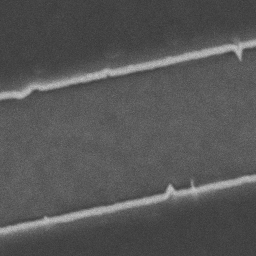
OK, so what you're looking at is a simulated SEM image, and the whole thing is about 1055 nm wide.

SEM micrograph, one or a few lines or trenches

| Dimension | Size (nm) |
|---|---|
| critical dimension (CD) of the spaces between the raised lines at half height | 540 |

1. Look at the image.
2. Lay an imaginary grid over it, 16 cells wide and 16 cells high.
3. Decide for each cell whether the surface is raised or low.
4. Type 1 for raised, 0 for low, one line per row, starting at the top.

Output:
1111111111111111
1111111111111111
1111111111111111
1111111111110000
1111111100000000
1100000000000000
0000000000000000
0000000000000000
0000000000000000
0000000000000000
0000000000000000
0000000000000011
0000000001111111
0000111111111111
1111111111111111
1111111111111111